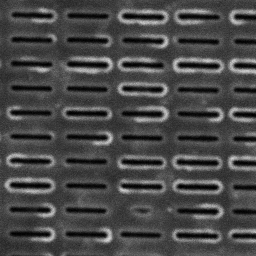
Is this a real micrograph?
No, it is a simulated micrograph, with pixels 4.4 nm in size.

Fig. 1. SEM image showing a regular array of holes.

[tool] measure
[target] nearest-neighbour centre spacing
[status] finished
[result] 106 nm